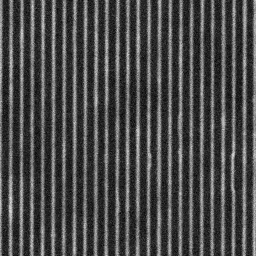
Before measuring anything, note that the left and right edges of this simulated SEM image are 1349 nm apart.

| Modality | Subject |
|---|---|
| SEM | parallel lines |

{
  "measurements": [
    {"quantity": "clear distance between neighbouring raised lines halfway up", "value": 8.5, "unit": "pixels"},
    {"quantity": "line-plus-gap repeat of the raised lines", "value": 56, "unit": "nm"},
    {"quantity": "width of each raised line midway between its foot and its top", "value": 13.2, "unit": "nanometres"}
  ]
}